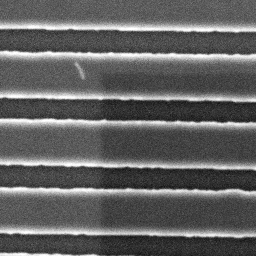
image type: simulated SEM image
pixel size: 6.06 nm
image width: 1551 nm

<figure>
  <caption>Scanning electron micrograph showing lines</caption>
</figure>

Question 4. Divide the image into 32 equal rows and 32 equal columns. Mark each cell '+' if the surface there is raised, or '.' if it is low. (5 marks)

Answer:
++++++++++++++++++++++++++++++++
++++++++++++++++++++++++++++++++
++++++++++++++++++++++++++++++++
.....+++++++++++++++++++++++++++
................................
................................
+...............................
++++++++++++++++++++++++++++++++
++++++++++++++++++++++++++++++++
++++++++++++++++++++++++++++++++
++++++++++++++++++++++++++++++++
++++++++++++++++++++++++++++++++
.....................+.+++++++++
................................
................................
++++++++++++++++++++++++++++++++
++++++++++++++++++++++++++++++++
++++++++++++++++++++++++++++++++
++++++++++++++++++++++++++++++++
++++++++++++++++++++++++++++++++
.+.+++++++++++++++++++++++++++++
................................
................................
................................
++++++++++++++++++++++++++++++++
++++++++++++++++++++++++++++++++
++++++++++++++++++++++++++++++++
++++++++++++++++++++++++++++++++
++++++++++++++++++++++++++++++++
.............................++.
................................
................................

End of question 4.